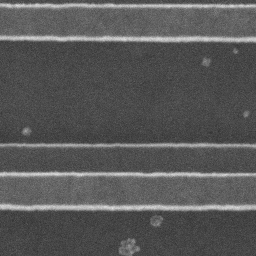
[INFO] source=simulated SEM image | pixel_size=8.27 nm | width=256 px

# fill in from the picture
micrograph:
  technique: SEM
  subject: lines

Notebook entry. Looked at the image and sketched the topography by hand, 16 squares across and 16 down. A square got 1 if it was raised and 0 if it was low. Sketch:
1111111111111111
1111111111111111
0000000000000011
0000000000000000
0000000000000000
0000000000000000
0000000000000000
0000000000000000
0000000000000000
0000000000000000
0000000000000000
1111111111111111
1111111111111111
0000000000000000
0000000000000000
0000000000000000